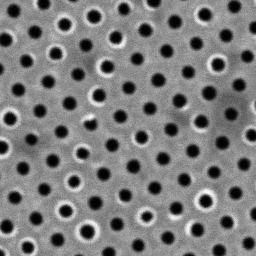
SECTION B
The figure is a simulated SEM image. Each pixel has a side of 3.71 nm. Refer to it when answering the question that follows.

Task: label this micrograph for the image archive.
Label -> a regular array of holes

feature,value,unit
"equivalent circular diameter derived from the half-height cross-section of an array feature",48.2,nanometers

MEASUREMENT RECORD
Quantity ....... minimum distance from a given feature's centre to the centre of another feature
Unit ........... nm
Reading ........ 111